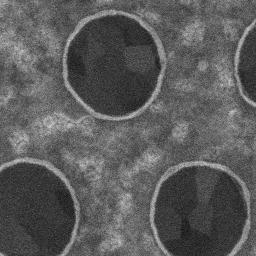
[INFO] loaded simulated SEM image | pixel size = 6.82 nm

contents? raised bodies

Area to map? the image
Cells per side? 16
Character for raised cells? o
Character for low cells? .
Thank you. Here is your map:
................
.....oooo.......
....oooooo.....o
....oooooo.....o
....oooooo.....o
....oooooo.....o
.....oooo.......
................
................
................
ooo........ooo..
oooo......ooooo.
ooooo.....ooooo.
ooooo.....oooooo
ooooo.....ooooo.
oooo......ooooo.